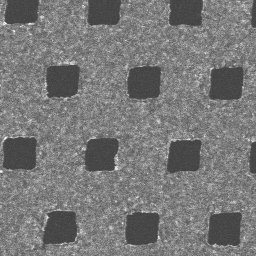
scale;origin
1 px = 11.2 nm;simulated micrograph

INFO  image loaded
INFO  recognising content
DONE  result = a regular array of holes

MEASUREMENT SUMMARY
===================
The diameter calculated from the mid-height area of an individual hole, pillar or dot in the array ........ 400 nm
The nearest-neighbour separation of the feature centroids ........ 914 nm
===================